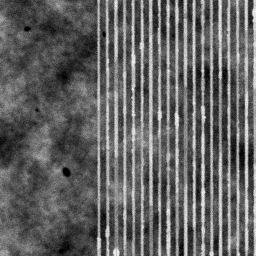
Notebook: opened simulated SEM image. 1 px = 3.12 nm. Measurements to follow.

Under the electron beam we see parallel lines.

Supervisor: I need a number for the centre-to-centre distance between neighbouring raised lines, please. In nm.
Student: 27.1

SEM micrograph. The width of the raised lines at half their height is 1.89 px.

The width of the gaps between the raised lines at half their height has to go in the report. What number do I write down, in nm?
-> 20.3